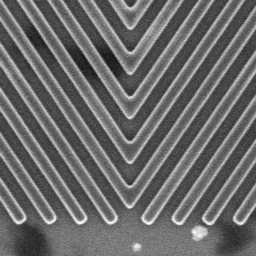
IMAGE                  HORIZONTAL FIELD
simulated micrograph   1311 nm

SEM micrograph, groups of lines, slits or small figures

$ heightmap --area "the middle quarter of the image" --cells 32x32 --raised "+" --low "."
+++....++++....+++....++++....++
++++....+++....+++....+++....+++
.+++....++++.........++++....+++
..+++....++++........+++....++++
..++++....+++.......+++....++++.
...+++....++++.....+++.....+++..
....+++....++++...++++....+++...
....++++....+++...+++....++++...
+....++++....++++++++....+++....
++....+++....+++++++....+++.....
++....++++....+++++....++++....+
+++....+++....++++.....+++....++
++++....+++....+++....+++....+++
.+++....++++.........++++....+++
.++++....++++........+++....++++
..++++....+++.......+++.....+++.
...+++....++++.....++++....+++..
...++++....+++....++++....++++..
....++++....+++...+++....++++...
+....+++....++++.++++....+++....
+.....+++....+++++++....++++....
++....++++....+++++....++++....+
+++....+++....+++++....+++....++
+++....++++....+++....+++....+++
.+++....++++....+....++++....+++
.++++....+++.........+++....++++
..+++....++++.......+++.....+++.
...+++....++++.....++++....+++..
...++++....+++....++++....++++..
....+++....++++...+++....++++...
.....+++....++++.++++....+++....
+....++++....+++++++....++++....